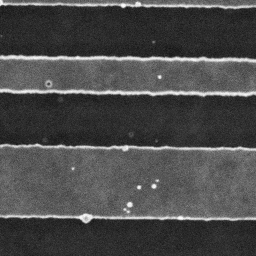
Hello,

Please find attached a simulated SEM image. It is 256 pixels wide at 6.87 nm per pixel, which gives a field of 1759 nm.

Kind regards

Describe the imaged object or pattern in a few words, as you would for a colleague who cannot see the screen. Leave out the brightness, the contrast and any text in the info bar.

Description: lines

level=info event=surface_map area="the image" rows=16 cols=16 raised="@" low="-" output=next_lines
--------------@-
----------------
----------------
----------------
@@@@@@@@@@@@@@@@
@@@@@@@@@@@@@@@@
----------------
----------------
----------------
@@@@@@@@@@@@@@@@
@@@@@@@@@@@@@@@@
@@@@@@@@@@@@@@@@
@@@@@@@@@@@@@@@@
@@@@@@@@@@@@@@@@
----------------
----------------